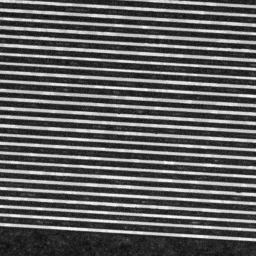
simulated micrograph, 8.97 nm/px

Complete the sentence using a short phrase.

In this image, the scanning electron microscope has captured parallel lines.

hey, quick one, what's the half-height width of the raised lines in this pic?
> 24.6 nanometres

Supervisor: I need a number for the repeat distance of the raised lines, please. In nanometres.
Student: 80.2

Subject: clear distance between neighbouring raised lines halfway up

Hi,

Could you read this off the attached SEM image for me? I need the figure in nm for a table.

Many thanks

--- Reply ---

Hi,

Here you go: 58.2